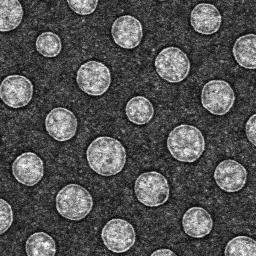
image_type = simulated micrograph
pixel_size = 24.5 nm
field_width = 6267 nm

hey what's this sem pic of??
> a regular array of raised bodies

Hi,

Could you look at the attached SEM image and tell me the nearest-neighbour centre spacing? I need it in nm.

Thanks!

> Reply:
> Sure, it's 1360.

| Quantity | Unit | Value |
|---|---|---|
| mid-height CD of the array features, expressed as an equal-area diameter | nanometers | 783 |